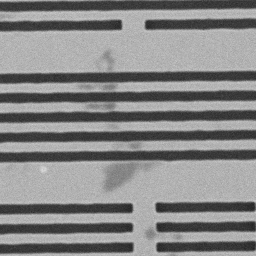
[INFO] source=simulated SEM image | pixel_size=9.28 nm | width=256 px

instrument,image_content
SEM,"groups of lines, slits or small figures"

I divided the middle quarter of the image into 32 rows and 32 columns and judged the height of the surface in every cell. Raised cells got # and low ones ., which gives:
################################
################################
................................
................................
..............................##
################################
################################
................................
................................
................................
################################
################################
................................
................................
..................##.###########
################################
################################
................................
................................
.................###############
################################
###############################.
................................
................................
..##############################
################################
################################
################################
################################
################################
################################
################################